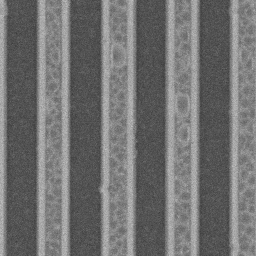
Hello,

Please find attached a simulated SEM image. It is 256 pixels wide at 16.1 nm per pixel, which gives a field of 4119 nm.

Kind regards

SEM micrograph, one or a few lines or trenches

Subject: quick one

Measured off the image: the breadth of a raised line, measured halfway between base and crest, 376 nm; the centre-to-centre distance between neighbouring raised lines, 1040 nm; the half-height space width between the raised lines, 40.9 pixels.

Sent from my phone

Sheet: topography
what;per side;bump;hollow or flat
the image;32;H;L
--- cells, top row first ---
LLLLLHHHLLLLLHHHLLLLLLHHLLLLLHHH
LLLLLHHHLLLLLHHHLLLLLLHHLLLLLHHH
LLLLLHHHLLLLLHHHLLLLLHHHLLLLLHHH
LLLLLHHHLLLLLHHHLLLLLHHHLLLLLHHH
LLLLLHHHLLLLLHHHLLLLLHHHLLLLLHHH
LLLLLHHHLLLLLHHHLLLLLHHHLLLLLHHH
LLLLLHHHLLLLLHHHLLLLLHHHLLLLLHHH
LLLLLHHHLLLLLHHHLLLLLHHHLLLLLHHH
LLLLLHHHLLLLLHHHLLLLLHHHLLLLLHHH
LLLLLHHHLLLLLHHHLLLLLHHHLLLLLHHH
LLLLLHHHLLLLLHHHLLLLLHHHLLLLLHHH
LLLLLHHHLLLLLHHHLLLLLHHHLLLLLHHH
LLLLLHHHLLLLLHHHLLLLLHHHLLLLLHHH
LLLLLHHHLLLLLHHHLLLLLHHHLLLLLHHH
LLLLLHHHLLLLLHHHLLLLLHHHLLLLLHHH
LLLLLHHHLLLLLHHHLLLLLHHHLLLLLHHH
LLLLLHHHLLLLLHHHLLLLLLHHLLLLLHHH
LLLLLHHHLLLLLHHHLLLLLHHHLLLLLHHH
LLLLLHHHLLLLLHHHLLLLLHHHLLLLLHHH
LLLLLHHHLLLLLHHHLLLLLHHHLLLLLHHH
LLLLLHHHLLLLLHHHLLLLLHHHLLLLLHHH
LLLLLHHHLLLLLHHHLLLLLHHHLLLLLHHH
LLLLLHHHLLLLLHHHLLLLLHHHLLLLLHHH
LLLLLHHHLLLLLHHHLLLLLHHHLLLLLHHH
LLLLLHHHLLLLLHHHLLLLLHHHLLLLLHHH
LLLLLHHHLLLLLHHHLLLLLHHHLLLLLHHH
LLLLLHHHLLLLLHHHLLLLLHHHLLLLLHHH
LLLLLHHHLLLLLHHHLLLLLHHHLLLLLHHH
LLLLLHHHLLLLLHHHLLLLLHHHLLLLLHHH
LLLLLHHHLLLLLHHHLLLLLHHHLLLLLHHH
LLLLLHHHLLLLLHHHLLLLLHHHLLLLLHHH
LLLLLHHHLLLLLHHHLLLLLHHHLLLLLHHH